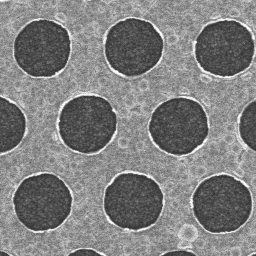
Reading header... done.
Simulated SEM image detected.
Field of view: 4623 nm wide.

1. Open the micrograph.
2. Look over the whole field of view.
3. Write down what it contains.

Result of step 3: a regular array of holes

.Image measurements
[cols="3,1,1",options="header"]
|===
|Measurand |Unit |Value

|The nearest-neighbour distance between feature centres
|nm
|1590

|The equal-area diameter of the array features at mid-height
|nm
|1050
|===